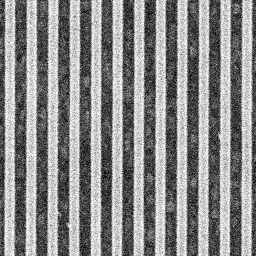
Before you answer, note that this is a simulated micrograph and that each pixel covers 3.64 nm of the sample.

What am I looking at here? parallel lines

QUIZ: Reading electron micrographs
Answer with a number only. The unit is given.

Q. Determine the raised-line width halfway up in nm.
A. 34.1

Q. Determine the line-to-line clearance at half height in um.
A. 0.0432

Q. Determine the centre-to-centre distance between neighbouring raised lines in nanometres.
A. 78.3